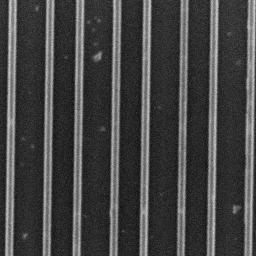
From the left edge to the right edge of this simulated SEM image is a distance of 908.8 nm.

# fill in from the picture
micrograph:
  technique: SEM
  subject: parallel lines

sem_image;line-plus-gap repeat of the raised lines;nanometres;121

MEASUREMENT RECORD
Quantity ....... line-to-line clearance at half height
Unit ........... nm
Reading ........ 107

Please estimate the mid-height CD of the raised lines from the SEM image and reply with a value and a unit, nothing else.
24.4 nm